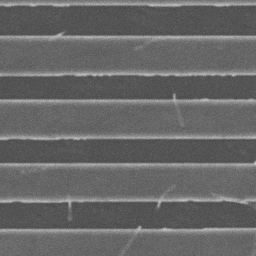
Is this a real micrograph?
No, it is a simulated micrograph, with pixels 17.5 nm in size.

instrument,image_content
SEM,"lines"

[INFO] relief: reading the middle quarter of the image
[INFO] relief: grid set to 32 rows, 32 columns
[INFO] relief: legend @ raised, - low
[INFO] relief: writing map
@@@@@@@@@@@@@@@@@@@@@@@@@@@@@@@@
@@@@@@@@@@@@@@@@@@@@@@@@@@@@@@@@
@@@@@@@@@@@@@@@@@@@@@@@@@@@@@@@@
--------------------------------
--------------------------------
--------------------------------
--------------------------------
--------------------------------
--------------------------------
@@@@@@@@@@@@@@@@@@@@@@@@@@@@@@@@
@@@@@@@@@@@@@@@@@@@@@@@@@@@@@@@@
@@@@@@@@@@@@@@@@@@@@@@@@@@@@@@@@
@@@@@@@@@@@@@@@@@@@@@@@@@@@@@@@@
@@@@@@@@@@@@@@@@@@@@@@@@@@@@@@@@
@@@@@@@@@@@@@@@@@@@@@@@@@@@@@@@@
@@@@@@@@@@@@@@@@@@@@@@@@@@@@@@@@
@@@@@@@@@@@@@@@@@@@@@@@@@@@@@@@@
@@@@@@@@@@@@@@@@@@@@@@@@@@@@@@@@
@@@@@@@@@@@@@@@@@@@@@@@@@@@@@@@@
--------------------------------
--------------------------------
--------------------------------
--------------------------------
--------------------------------
--------------------------------
@@@@@@@@@@@@@@@@@@@@@@@@@@@@@@@@
@@@@@@@@@@@@@@@@@@@@@@@@@@@@@@@@
@@@@@@@@@@@@@@@@@@@@@@@@@@@@@@@@
@@@@@@@@@@@@@@@@@@@@@@@@@@@@@@@@
@@@@@@@@@@@@@@@@@@@@@@@@@@@@@@@@
@@@@@@@@@@@@@@@@@@@@@@@@@@@@@@@@
@@@@@@@@@@@@@@@@@@@@@@@@@@@@@@@@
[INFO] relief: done